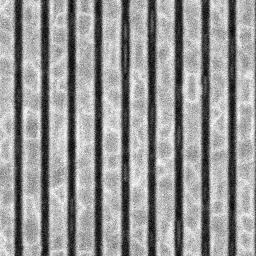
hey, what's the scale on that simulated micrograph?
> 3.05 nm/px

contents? parallel lines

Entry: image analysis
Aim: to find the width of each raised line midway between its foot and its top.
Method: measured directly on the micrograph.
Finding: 0.0552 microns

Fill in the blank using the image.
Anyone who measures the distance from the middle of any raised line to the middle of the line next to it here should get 81.6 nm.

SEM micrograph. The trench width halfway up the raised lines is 26.7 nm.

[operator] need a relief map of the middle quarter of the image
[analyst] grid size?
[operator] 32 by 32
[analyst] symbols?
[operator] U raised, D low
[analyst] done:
UDDUUUUDDDUUUUDDDUUUUDDUUUUDDDUU
UDDUUUUDDDUUUUDDDUUUUDDUUUUDDDUU
UDDUUUUDDDUUUUDDDUUUUDDUUUUDDDUU
UDDUUUUDDDUUUUDDDUUUUDDUUUUDDDUU
UDDUUUUDDDUUUUDDDUUUUDDUUUUDDDUU
UDDUUUUDDDUUUUDDDUUUUDDUUUUDDDUU
UDDUUUUDDDUUUUDDDUUUUDDUUUUDDDUU
UDDUUUUDDDUUUUDDDUUUUDDUUUUDDDUU
UDDUUUUDDDUUUUDDDUUUUDDUUUUDDDUU
UDDUUUUDDDUUUUDDDUUUUDDUUUUDDDUU
UDDUUUUDDDUUUUDDDUUUUDDUUUUDDDUU
UDDUUUUDDDUUUUDDDUUUUDDUUUUDDDUU
UDDUUUUDDDUUUUDDDUUUUDDUUUUDDDUU
UDDUUUUDDDUUUUDDDUUUUDDUUUUDDDUU
UDDUUUUDDDUUUUDDDUUUUDDUUUUDDDUU
UDDUUUUDDDUUUUDDDUUUUDDUUUUDDDUU
UDDUUUUDDDUUUUDDDUUUUDDUUUUDDDUU
UDDUUUUDDDUUUUDDDUUUUDDUUUUDDDUU
UDDUUUUDDDUUUUDDDUUUUDDUUUUDDDUU
UDDUUUUDDDUUUUDDDUUUUDDUUUUDDDUU
UDDUUUUDDDUUUUDDDUUUUDDUUUUDDDUU
UDDUUUUDDDUUUUDDDUUUUDDUUUUDDDUU
UDDUUUUDDDUUUUDDDUUUUDDUUUUDDDUU
UDDUUUUDDDUUUUDDDUUUUDDUUUUDDDUU
UDDUUUUDDDUUUUDDDUUUUDDUUUUDDDUU
UDDUUUUDDDUUUUDDDUUUUDDUUUUDDDUU
UDDUUUUDDDUUUUDDDUUUUDDUUUUDDDUU
UDDUUUUDDDUUUUDDDUUUUDDUUUUDDDUU
UDDUUUUDDDUUUUDDDUUUUDDUUUUDDDUU
UDDUUUUDDDUUUUDDDUUUUDDUUUUDDDUU
UDDUUUUDDDUUUUDDDUUUUDDUUUUDDDUU
UDDUUUUDDDUUUUDDDUUUUDDUUUUDDDUU